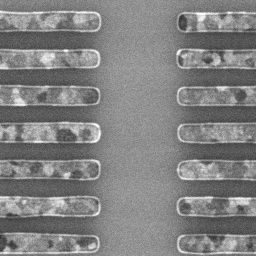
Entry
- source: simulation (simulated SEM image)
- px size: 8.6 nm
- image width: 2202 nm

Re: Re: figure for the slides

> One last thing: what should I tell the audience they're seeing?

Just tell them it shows groups of lines, slits or small figures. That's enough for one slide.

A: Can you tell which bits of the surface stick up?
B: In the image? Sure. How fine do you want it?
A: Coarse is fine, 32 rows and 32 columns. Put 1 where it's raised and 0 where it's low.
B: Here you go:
00000000000000000000000000000000
00000000000000000000000000000000
11111111111100000000001111111111
11111111111100000000001111111111
00000000000000000000000000000000
00000000000000000000000000000000
11111111111100000000001111111111
11111111111100000000001111111111
01000000000000000000000000000000
00000000000000000000000000000000
00000000000000000000000000000000
11111111111100000000001111111111
11111111111100000000001111111111
00000000000000000000000000000000
00000000000000000000000000000000
11111111111100000000000001111111
11111111111100000000001111111111
11111111111100000000000111111111
00000000000000000000000000000000
00000000000000000000000000000000
11111111111100000000000111111111
11111111111100000000001111111111
00000000000000000000000000000000
00000000000000000000000000000000
00000000000000000000000000000000
11111111111100000000001111111111
11111111111100000000001111111111
00000000000000000000000000000000
00000000000000000000000000000000
11111111110000000000000111111001
11111111111100000000001111111111
11111111100000000000000111111111